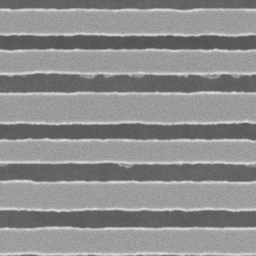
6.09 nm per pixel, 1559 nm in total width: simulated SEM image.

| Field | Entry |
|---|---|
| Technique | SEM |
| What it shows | lines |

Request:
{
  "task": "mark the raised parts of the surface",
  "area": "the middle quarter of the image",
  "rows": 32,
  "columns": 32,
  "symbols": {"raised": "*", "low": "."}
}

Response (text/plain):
********************************
********************************
.....***...****.*....***********
................................
................................
................................
................................
******************************.*
********************************
********************************
********************************
********************************
********************************
********************************
********************************
................................
................................
................................
................................
********************************
********************************
********************************
********************************
********************************
**********..********************
................................
................................
................................
................................
*.*******..********.*****.**.***
********************************
********************************